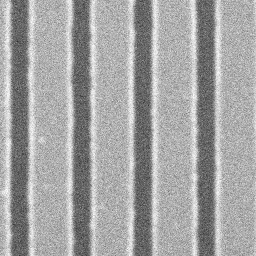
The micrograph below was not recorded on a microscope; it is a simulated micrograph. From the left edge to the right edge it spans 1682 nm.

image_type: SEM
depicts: lines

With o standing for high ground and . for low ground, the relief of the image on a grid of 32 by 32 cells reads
o...ooooo..oooooo..ooooo...ooooo
o...ooooo..oooooo..ooooo...ooooo
o...ooooo..oooooo..ooooo...ooooo
o...ooooo..oooooo..ooooo...ooooo
o...ooooo...ooooo..ooooo...ooooo
o...ooooo..oooooo..ooooo...ooooo
o...ooooo..oooooo..ooooo...ooooo
o...ooooo..oooooo..ooooo...ooooo
o...ooooo..oooooo..ooooo...ooooo
o...ooooo..oooooo..ooooo...ooooo
o...ooooo...ooooo..ooooo...ooooo
o...ooooo..oooooo..oooooo..ooooo
o...ooooo..oooooo..oooooo..ooooo
o...ooooo..oooooo..ooooo...ooooo
o...ooooo...ooooo..ooooo...ooooo
o...ooooo..oooooo..ooooo...ooooo
o...ooooo..oooooo..oooooo..ooooo
o...ooooo...ooooo..ooooo...ooooo
o...ooooo..oooooo..oooooo..ooooo
o...ooooo...ooooo..oooooo..ooooo
o...ooooo...ooooo..oooooo..ooooo
o...ooooo...ooooo..oooooo..ooooo
o...ooooo...ooooo..oooooo..ooooo
o...ooooo...ooooo..ooooo...ooooo
o...ooooo...ooooo..oooooo..ooooo
o...ooooo...ooooo..oooooo..ooooo
o...ooooo...ooooo..oooooo..ooooo
o...ooooo...ooooo..oooooo..ooooo
o...ooooo..oooooo..oooooo..ooooo
o...ooooo...ooooo..ooooo...ooooo
o...ooooo...ooooo..oooooo..ooooo
o...ooooo...oooo...oooooo..ooooo